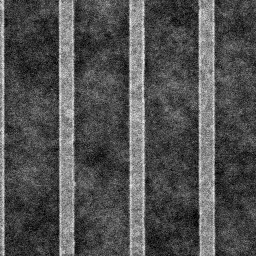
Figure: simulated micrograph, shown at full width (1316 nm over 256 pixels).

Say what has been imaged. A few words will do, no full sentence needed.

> one or a few lines or trenches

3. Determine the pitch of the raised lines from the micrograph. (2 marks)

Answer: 70.3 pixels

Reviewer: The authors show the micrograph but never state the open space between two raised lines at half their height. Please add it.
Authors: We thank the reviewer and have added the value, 56.8 px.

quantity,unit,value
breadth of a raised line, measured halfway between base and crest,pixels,13.9